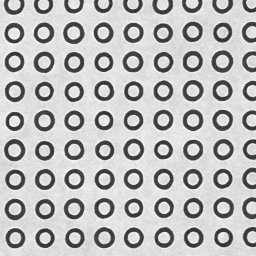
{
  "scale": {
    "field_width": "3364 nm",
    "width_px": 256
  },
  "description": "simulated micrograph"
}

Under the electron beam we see a regular array of ring-shaped grooves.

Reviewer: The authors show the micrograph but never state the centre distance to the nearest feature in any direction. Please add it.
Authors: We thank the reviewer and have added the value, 381 nm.